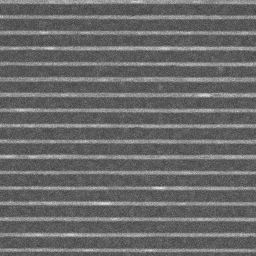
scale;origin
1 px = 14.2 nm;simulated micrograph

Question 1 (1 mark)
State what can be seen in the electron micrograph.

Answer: parallel lines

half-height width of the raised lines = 46.2 nm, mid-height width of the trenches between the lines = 174 nm